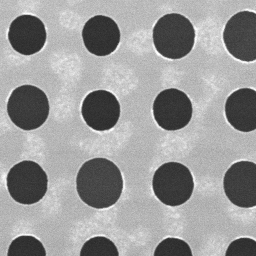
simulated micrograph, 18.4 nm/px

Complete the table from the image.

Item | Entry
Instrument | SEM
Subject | a regular array of holes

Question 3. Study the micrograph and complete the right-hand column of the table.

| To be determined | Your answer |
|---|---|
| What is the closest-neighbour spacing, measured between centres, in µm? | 1.34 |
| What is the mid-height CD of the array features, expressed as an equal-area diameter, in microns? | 0.79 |